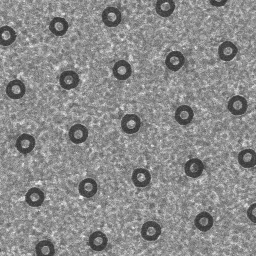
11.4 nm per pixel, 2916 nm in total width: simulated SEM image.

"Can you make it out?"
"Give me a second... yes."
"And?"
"a regular array of ring-shaped grooves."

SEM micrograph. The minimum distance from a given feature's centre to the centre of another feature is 612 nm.